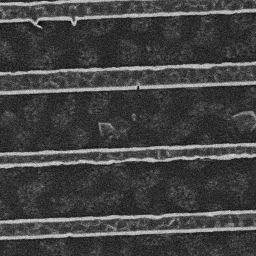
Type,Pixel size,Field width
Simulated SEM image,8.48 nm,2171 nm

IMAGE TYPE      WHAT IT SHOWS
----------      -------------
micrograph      one or a few lines or trenches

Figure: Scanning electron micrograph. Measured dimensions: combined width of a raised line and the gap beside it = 619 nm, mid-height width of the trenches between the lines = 0.469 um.